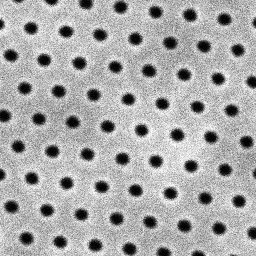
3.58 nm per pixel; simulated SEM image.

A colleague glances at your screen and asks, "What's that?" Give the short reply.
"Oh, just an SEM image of a regular array of holes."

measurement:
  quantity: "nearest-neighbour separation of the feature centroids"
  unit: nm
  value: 121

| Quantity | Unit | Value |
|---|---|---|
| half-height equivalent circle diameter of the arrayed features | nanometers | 46.4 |